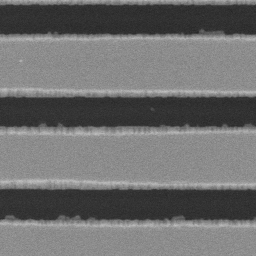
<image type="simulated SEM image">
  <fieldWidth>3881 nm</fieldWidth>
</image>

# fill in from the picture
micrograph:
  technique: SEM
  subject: lines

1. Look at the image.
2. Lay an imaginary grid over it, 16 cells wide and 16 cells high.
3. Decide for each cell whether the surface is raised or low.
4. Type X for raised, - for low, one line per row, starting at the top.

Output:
----------------
----------------
XXXXXXXXXXXXXXXX
XXXXXXXXXXXXXXXX
XXXXXXXXXXXXXXXX
XXXXXXXXXXXXXXXX
----------------
----------------
XXXXXXXXXXXXXXXX
XXXXXXXXXXXXXXXX
XXXXXXXXXXXXXXXX
XXXXXXXXXXXXXXXX
----------------
----------------
XXXXXXXXXXXXXXXX
XXXXXXXXXXXXXXXX